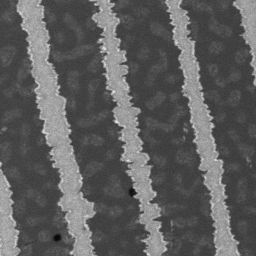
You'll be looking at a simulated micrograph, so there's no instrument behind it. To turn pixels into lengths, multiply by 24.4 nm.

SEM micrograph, one or a few lines or trenches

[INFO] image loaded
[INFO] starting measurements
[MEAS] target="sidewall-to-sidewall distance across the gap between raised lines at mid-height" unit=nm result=1310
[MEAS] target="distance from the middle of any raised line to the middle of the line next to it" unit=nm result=1730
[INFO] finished